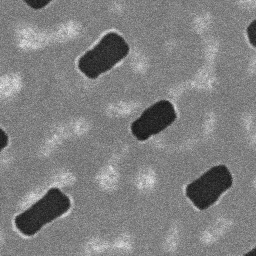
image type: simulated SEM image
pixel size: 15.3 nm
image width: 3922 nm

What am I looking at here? holes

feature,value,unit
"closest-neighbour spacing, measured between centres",1290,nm